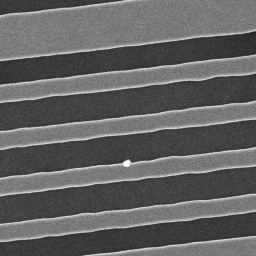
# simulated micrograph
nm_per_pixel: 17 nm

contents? groups of lines, slits or small figures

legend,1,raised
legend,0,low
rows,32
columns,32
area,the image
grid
00000000000011111111111111111111
00001111111111111111111111111111
11111111111111111111111111111111
11111111111111111111111111111111
11111111111111111111111111100000
11111111111111111110000000000000
11111111110000000000000000000000
10000000000000000000000000011111
00000000000000000001111111111111
00000000011111111111111111100000
01111111111111111111000000000000
11111111111100000000000000000000
11100000000000000000000000000000
00000000000000000000000011111111
00000000000000001111111111111111
00000000111111111111111111100000
11111111111111111110000000000000
11111111111000000000000000000000
10000000000000000000000000000000
00000000000000000000000111111111
00000000000000011111111111111111
00000001111111111111111111000000
11111111111111111000000000000000
11111111000000000000000000000000
00000000000000000000000000000011
00000000000000000000011111111111
00000000000001111111111111111110
00001111111111111111111100000000
11111111111111000000000000000000
11111100000000000000000000000000
00000000000000000000000111111111
00000000000000011111111111111111